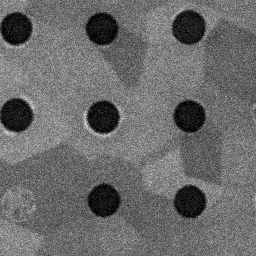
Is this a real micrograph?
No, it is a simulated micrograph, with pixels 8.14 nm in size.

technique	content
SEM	holes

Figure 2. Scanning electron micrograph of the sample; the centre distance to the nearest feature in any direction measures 0.697 microns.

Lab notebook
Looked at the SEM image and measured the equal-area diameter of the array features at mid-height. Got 0.271 micrometres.